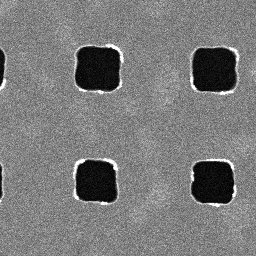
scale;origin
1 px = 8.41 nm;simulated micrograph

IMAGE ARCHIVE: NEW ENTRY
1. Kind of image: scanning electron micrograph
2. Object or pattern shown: holes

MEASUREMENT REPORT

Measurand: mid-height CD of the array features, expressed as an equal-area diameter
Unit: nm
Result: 390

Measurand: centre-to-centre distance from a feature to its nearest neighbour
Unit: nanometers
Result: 949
